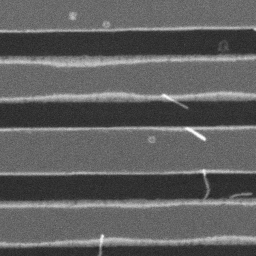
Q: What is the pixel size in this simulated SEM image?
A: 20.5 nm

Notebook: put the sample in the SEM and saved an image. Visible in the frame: lines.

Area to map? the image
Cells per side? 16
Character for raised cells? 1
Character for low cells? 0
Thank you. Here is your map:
1111111111111111
1111111111111111
0000000000000000
0000000000000000
1111111111111111
1111111111111111
0000000000000000
0000000000000000
1111111111111111
1111111111111111
1111111111111111
0000000000000000
0000000000000000
1111111111111111
1111111111111111
0000000000000000